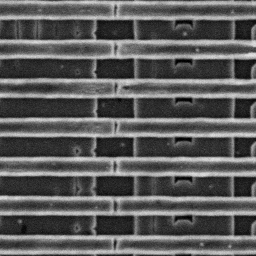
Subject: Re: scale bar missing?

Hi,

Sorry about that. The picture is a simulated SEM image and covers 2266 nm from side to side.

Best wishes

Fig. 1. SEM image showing wiring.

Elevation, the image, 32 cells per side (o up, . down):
oooooooooooooooooooooooooooooooo
oooooooooooooooooooooooooooooooo
................................
................................
................................
oooooooooooooooooooooooooooooooo
oooooooooooooooooooooooooooooooo
................................
................................
................................
oooooooooooooooooooooooooooooooo
oooooooooooooooooooooooooooooooo
................................
................................
................................
oooooooooooooooooooooooooooooooo
oooooooooooooooooooooooooooooooo
................................
................................
................................
oooooooooooooooooooooooooooooooo
oooooooooooooooooooooooooooooooo
................................
................................
................................
oooooooooooooooooooooooooooooooo
oooooooooooooooooooooooooooooooo
................................
................................
................................
oooooooooooooooooooooooooooooooo
ooooooooooooooo.oooooooooooooooo